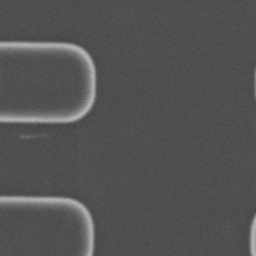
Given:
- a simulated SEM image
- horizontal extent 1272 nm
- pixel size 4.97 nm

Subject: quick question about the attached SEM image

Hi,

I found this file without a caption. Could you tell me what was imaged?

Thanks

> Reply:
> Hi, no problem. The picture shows wiring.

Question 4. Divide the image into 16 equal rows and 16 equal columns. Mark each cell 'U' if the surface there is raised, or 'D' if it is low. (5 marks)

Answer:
DDDDDDDDDDDDDDDD
DDDDDDDDDDDDDDDD
DDDDDDDDDDDDDDDD
UUUUUDDDDDDDDDDD
UUUUUUDDDDDDDDDD
UUUUUUDDDDDDDDDD
UUUUUUDDDDDDDDDD
DUUUDDDDDDDDDDDD
DDDDDDDDDDDDDDDD
DDDDDDDDDDDDDDDD
DDDDDDDDDDDDDDDD
DDDDDDDDDDDDDDDD
UUUUDDDDDDDDDDDD
UUUUUUDDDDDDDDDD
UUUUUUDDDDDDDDDD
UUUUUUDDDDDDDDDD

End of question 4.